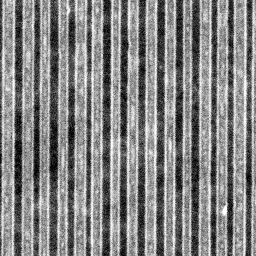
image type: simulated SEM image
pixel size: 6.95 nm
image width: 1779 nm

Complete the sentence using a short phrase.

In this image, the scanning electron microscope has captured parallel lines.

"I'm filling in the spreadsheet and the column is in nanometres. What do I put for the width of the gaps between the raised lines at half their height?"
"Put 54.7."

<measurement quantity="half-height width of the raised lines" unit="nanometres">66.8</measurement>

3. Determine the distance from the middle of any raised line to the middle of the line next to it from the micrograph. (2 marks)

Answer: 123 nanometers